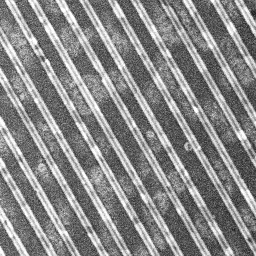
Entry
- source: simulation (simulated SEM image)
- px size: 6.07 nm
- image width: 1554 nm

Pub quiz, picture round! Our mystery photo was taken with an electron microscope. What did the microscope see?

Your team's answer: parallel lines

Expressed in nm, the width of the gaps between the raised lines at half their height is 96.7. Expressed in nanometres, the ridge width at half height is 30.2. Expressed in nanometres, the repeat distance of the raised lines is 135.